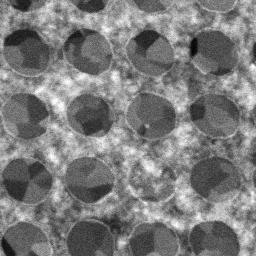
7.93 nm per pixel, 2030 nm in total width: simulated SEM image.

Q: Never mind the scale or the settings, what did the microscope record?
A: a regular array of raised bodies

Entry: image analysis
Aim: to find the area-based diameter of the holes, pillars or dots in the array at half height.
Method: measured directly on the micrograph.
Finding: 0.387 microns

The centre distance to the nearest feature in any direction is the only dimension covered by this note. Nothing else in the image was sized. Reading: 0.493 µm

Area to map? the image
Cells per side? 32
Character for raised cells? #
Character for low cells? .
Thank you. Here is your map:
.#####...####....#####...####...
..........###.....##.......#....
................................
..........#.....................
.####....####....####...####....
######..######..#####...#####...
######..######..######..######..
.#####..######..######..######..
.#####...#####...####....####..#
...##..............#.......#....
................................
................................
.####....####...#####...#####...
######..######..######..######..
######..######..######..######..
######...#####..######..######..
.#####...#####...#####...####...
...#............................
................................
................................
.####....####...........#####...
######..######..........######..
#######.######..........######.#
.######.######..........######..
.#####...#####...........#####.#
....#............#..............
................................
...........#....................
.####....#####...#####..#####...
######..######..######..######..
######..######..######..######..
######...#####..######..######..